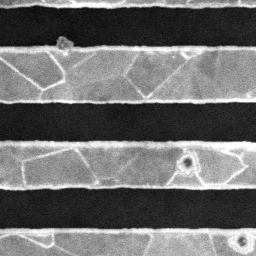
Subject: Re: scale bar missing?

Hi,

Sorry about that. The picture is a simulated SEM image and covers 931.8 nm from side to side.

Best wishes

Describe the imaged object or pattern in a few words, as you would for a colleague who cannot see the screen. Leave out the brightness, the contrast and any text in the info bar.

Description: lines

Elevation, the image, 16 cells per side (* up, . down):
................
................
................
****************
****************
****************
................
................
................
****************
****************
****************
................
................
****************
****************